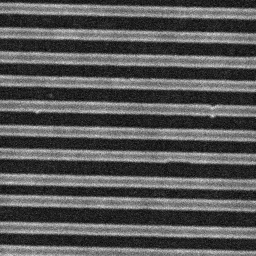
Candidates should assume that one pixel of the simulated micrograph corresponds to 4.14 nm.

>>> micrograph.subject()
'parallel lines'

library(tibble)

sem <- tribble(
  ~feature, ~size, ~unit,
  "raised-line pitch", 0.101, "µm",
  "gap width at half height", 0.0615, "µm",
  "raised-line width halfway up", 39.8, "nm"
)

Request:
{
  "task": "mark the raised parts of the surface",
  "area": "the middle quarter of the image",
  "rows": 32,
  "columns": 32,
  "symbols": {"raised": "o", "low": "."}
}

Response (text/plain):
................................
................................
................................
.o.o....o.......................
oooooooooooooooooooooooooooooooo
oooooooooooooooooooooooooooooooo
................................
................................
................................
ooo.............................
oooooooooooooooooooooooooooooooo
oooooooooooooooooooooooooooooooo
.......................ooooooooo
................................
................................
................................
ooooooooooooooooooooooooooooooo.
oooooooooooooooooooooooooooooooo
..............oooooooooooooooooo
................................
................................
................................
oooooooooooooooooooooooooooooooo
oooooooooooooooooooooooooooooooo
...............................o
................................
................................
................................
ooooooooooooooooooo.............
oooooooooooooooooooooooooooooooo
...........ooooooooooooooooooooo
................................